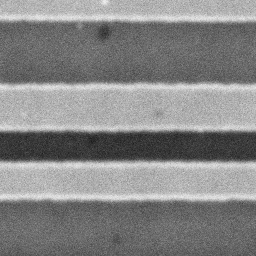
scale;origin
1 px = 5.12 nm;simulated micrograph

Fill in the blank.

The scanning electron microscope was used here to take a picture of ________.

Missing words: lines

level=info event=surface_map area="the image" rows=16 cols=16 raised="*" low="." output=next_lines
****************
................
................
................
................
****************
****************
****************
................
................
****************
****************
................
................
................
................